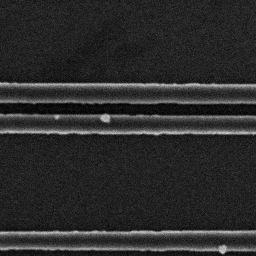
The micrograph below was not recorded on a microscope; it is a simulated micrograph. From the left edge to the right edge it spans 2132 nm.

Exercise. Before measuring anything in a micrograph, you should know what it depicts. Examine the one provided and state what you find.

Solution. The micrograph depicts lines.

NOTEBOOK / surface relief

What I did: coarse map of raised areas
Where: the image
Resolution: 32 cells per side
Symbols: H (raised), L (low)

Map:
LLLLLLLLLLLLLLLLLLLLLLLLLLLLLLLL
LLLLLLLLLLLLLLLLLLLLLLLLLLLLLLLL
LLLLLLLLLLLLLLLLLLLLLLLLLLLLLLLL
LLLLLLLLLLLLLLLLLLLLLLLLLLLLLLLL
LLLLLLLLLLLLLLLLLLLLLLLLLLLLLLLL
LLLLLLLLLLLLLLLLLLLLLLLLLLLLLLLL
LLLLLLLLLLLLLLLLLLLLLLLLLLLLLLLL
LLLLLLLLLLLLLLLLLLLLLLLLLLLLLLLL
LLLLLLLLLLLLLLLLLLLLLLLLLLLLLLLL
LLLLLLLLLLLLLLLLLLLLLLLLLLLLLLLL
HLLLLLLLLLLLLLLLLLLLLLLLLLLLLLLL
HHHHHHHHHHHHHHHHHHHHHHHHHHHHHHHH
HHHHHHHHHHHHHHHHHHHHHHHHHHHHHHHH
LLLLLLLLLLLLLLLLLLLLLLLLLLLLLLLL
HHHHHHHHHHHHHHHHLHLHLLLLLLLLLLLL
HHHHHHHHHHHHHHHHHHHHHHHHHHHHHHHH
HHHHHHHHHHHHHHHHHHHHHHHHHHHHHHHH
LLLLLLLLLLLLLLLLLLLLLLLLLLLLLLLL
LLLLLLLLLLLLLLLLLLLLLLLLLLLLLLLL
LLLLLLLLLLLLLLLLLLLLLLLLLLLLLLLL
LLLLLLLLLLLLLLLLLLLLLLLLLLLLLLLL
LLLLLLLLLLLLLLLLLLLLLLLLLLLLLLLL
LLLLLLLLLLLLLLLLLLLLLLLLLLLLLLLL
LLLLLLLLLLLLLLLLLLLLLLLLLLLLLLLL
LLLLLLLLLLLLLLLLLLLLLLLLLLLLLLLL
LLLLLLLLLLLLLLLLLLLLLLLLLLLLLLLL
LLLLLLLLLLLLLLLLLLLLLLLLLLLLLLLL
LLLLLLLLLLLLLLLLLLLLLLLLLLLLLLLL
LLLLLLLLLLLLLLLLLLLLLLLLLLLLLLLL
HHHHHHHHHHHHHHHHHHHHHHHHHHHHHHHH
HHHHHHHHHHHHHHHHHHHHHHHHHHHHHHHH
LLLLLLLLLLLLLLLLLLLLLLLLLLLHLLLL